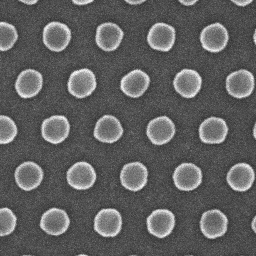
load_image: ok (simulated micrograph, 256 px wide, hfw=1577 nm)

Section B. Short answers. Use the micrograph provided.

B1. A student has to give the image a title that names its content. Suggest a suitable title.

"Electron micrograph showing a regular array of raised bodies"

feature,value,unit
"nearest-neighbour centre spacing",324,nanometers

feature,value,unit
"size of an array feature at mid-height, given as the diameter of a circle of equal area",0.168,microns